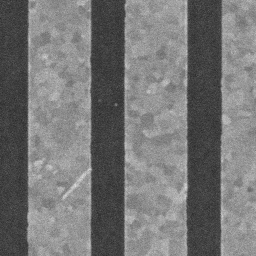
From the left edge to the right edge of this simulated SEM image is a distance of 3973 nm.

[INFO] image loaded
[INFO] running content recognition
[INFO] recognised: lines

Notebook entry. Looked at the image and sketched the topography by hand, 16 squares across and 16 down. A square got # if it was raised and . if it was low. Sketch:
..####..####..##
..####..####..##
..####..####..##
..####..####..##
..####..####..##
..####..####..##
..####..####..##
..####..####..##
..####..####..##
..####..####..##
..####..####..##
..####..####..##
..####..####..##
..####..####..##
..####..####..##
..####..####..##